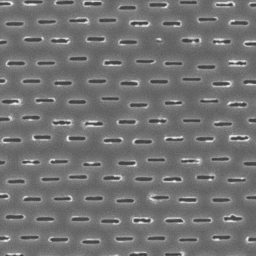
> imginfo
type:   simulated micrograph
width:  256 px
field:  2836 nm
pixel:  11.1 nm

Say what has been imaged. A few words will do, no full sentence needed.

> a regular array of holes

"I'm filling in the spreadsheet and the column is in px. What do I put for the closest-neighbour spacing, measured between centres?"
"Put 22.7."